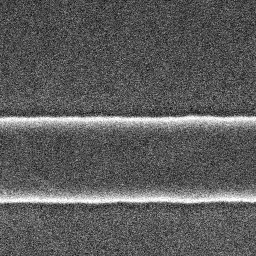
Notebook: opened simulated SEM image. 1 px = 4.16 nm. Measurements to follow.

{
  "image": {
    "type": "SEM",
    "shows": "one or a few lines or trenches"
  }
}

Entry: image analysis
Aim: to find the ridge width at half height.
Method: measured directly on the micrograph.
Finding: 345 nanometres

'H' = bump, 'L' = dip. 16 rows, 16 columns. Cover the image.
LLLLLLLLLLLLLLLL
LLLLLLLLLLLLLLLL
LLLLLLLLLLLLLLLL
LLLLLLLLLLLLLLLL
LLLLLLLLLLLLLLLL
LLLLLLLLLLLLLLLL
LLLLLLLLLLLLLLLL
HHHHHHHHHHHHHHHH
HHHHHHHHHHHHHHHH
HHHHHHHHHHHHHHHH
HHHHHHHHHHHHHHHH
HHHHHHHHHHHHHHHH
HHHHHHHHHHHHHHHH
LLLLLLLLLLLLLLLL
LLLLLLLLLLLLLLLL
LLLLLLLLLLLLLLLL